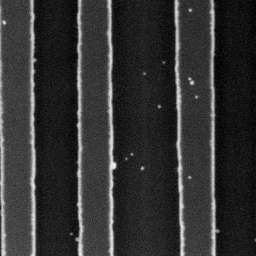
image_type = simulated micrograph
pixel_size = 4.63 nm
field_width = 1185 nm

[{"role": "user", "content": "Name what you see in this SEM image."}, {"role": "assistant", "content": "lines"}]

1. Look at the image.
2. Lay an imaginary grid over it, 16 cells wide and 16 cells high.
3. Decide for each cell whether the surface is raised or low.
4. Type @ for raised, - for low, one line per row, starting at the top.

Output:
@@---@@----@@---
@@---@@----@@---
@@---@@----@@---
@@---@@----@@---
@@---@@----@@---
@@---@@----@@---
@@---@@----@@---
@@---@@----@@---
@@---@@----@@---
@@---@@----@@---
@@---@@----@@---
@@---@@----@@---
@@---@@----@@---
@@---@@----@@---
@@---@@----@@---
@@---@@----@@---